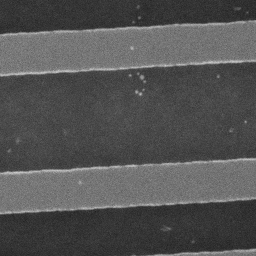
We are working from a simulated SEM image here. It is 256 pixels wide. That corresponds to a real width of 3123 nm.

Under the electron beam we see lines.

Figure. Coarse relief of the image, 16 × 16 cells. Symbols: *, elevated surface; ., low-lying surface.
................
.............***
****************
****************
****............
................
................
................
................
................
.....***********
****************
***************.
................
................
................